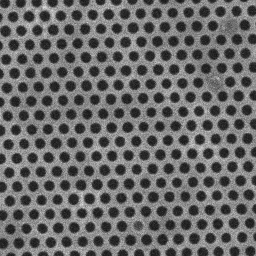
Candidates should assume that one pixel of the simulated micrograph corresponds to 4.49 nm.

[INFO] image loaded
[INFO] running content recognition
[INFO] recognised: a regular array of holes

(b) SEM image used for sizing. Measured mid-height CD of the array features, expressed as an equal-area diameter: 50.1 nanometres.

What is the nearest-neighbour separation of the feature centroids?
70.9 nm